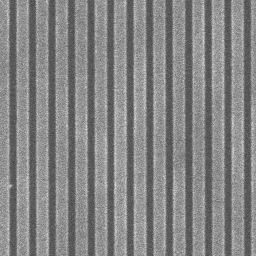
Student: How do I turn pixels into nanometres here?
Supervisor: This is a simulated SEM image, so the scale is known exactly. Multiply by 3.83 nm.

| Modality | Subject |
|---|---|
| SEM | parallel lines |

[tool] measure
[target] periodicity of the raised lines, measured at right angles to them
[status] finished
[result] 74.9 nm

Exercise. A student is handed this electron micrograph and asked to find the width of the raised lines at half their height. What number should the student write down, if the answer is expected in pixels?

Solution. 11.5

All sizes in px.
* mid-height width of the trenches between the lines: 8.02